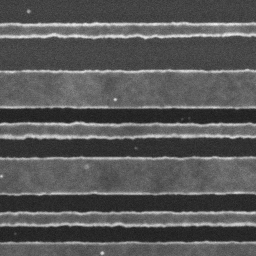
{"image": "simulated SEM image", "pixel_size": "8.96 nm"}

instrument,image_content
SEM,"lines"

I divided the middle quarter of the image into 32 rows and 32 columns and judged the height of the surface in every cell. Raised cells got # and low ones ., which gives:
................................
..........................#.....
################################
################################
################################
################################
################################
################################
################################
################################
################################
................................
................................
................................
................................
################################
################################
################################
#####################........##.
................................
................................
................................
................................
######################.######.##
################################
################################
################################
################################
################################
################################
################################
################################